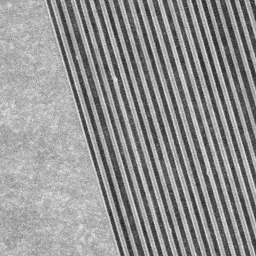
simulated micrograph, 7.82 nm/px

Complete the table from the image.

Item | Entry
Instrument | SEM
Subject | parallel lines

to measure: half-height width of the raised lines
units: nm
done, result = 26.3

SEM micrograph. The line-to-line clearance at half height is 45.9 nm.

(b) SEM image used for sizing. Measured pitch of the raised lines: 72.7 nm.